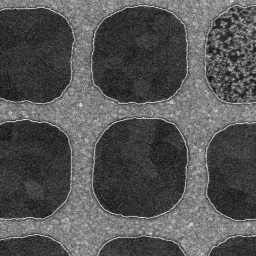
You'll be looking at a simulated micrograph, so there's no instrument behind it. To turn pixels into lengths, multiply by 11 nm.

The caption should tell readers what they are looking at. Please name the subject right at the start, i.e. raised bodies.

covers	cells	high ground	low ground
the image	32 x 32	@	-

--------------------------------
@@-@@@@--------@@@@@@-----------
@@@@@@@@-----@@@@@@@@@----------
@@@@@@@@@---@@@@@@@@@@@---------
@@@@@@@-@---@@@@@@@@@@@---------
@@@@-@-@@---@@@@@@@@@@@-------@-
@@-@@@@@@---@@@@@@@@@@@---------
@@@@@@@@@--@@@@@@@@@@@----------
@@@@@@@@@---@@@@@@@@@@@---------
@@@@@@@@@---@@@@@@@@@@@-----@---
@@@@@@@@@---@@@@@@@@@@@---------
@@@@@@@@-----@@@@@@@@@----------
-@@@@@@-------@@@@-@@-----------
--------------------------------
--------------------------------
@@@@@@--------@@@@@@@--------@@@
@@@@@@@@-----@@@@@@@@@@----@@@@@
@-@@@@@@@---@@@-@@@-@@@---@@@@@@
@@@@@@@@@---@@@@@@@@@@@---@@@@@@
-@@@@@@@@---@@@@@@@@@@@---@@@@@@
@@@@@@@@@---@@-@@@@@@@@---@@@@@@
@@@@@@@@@---@@@@@@@@@@@---@@@@@@
@@@@@@@@----@@@@@@@@@@@---@@@@@@
@@@-@@@@@---@@@@@@@-@@@---@@@@@@
@@@@@@@@@---@@@@@@@@@@@---@@@@@@
@@@@@@@@-----@@@@@@@@@-----@@@@@
@@@@@@@-------@@@@@@@------@@@@@
-----------------------------@@-
--------------------------------
----@---------------------------
@@@@@@@@-----@@@@@@@@@-----@@@@@
@@@@@@@@----@@@@@@@@@@@----@@@@@